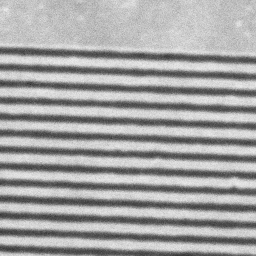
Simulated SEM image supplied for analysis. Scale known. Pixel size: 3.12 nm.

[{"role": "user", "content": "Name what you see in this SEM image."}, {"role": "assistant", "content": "parallel lines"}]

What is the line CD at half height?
18.3 nm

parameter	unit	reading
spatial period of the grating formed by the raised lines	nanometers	51.3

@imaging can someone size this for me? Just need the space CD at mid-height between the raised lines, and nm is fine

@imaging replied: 31.5